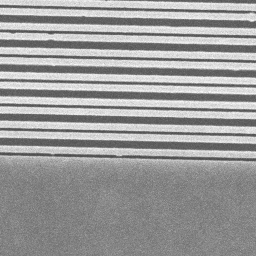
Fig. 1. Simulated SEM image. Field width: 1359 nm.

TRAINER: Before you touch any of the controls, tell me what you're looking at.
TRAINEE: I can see parallel lines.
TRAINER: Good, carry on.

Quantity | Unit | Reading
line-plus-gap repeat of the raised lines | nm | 65.8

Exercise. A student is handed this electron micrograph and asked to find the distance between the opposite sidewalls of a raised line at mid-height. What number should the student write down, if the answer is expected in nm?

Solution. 39.2